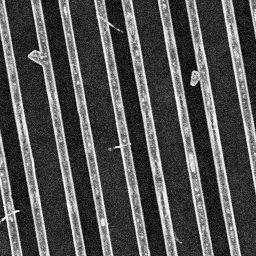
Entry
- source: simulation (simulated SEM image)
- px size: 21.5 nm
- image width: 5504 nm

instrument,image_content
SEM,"parallel lines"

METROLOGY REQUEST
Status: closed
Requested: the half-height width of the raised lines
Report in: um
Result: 0.199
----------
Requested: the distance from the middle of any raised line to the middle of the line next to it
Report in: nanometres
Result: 675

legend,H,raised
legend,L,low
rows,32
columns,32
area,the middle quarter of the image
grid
LLHHLLLLLLLHHLLLLLHHLLLLLLLHHLLL
LLHHLLLLLLLHHLLLLLHHLLLLLLLHHLLL
LLHHLLLLLLLHHLLLLLHHLLLLLLLHHLLL
LLHHLLLLLLLHHHLLLLHHLLLLLLLHHLLL
LLHHLLLLLLLHHHLLLLHHLLLLLLLHHHLL
LLLHHLLLLLLLHHLLLLHHHLLLLLLHHHLL
LLLHHLLLLLLLHHLLLLLHHLLLLLLLHHLL
LLLHHLLLLLLLHHLLLLLHHLLLLLLLHHLL
LLLHHLLLLLLLHHLLLLLHHLLLLLLLHHLL
LLLHHLLLLLLLHHLLLLLHHLLLLLLLHHLL
LLLLHHLLLLLLLHHLLLLHHLLLLLLLHHHL
LLLLHHLLLLLLLHHLLLLHHHLLLLLLLHHL
LLLLHHLLLLLLLHHLLLLLHHLLLLLLLHHL
LLLLHHLLLLLLLHHLLLLLHHLLLLLLLHHL
LLLLHHLLLLLLLHHLLLLLHHLLLLLLLHHL
LLLLHHLLLLLLLHHHLLLLHHHLLLLLLHHL
LLLLLHHLLLLLLLHHLLLLHHHLLLLLLHHH
LLLLLHHLLLLLLLHHLLLLHHHLLLLLLLHH
LLLLLHHLLLLLLLHHLLLLLHHLLLLLLLHH
LLLLLHHLLLLLLLHHLLLLLHHLLLLLLLHH
LLLLLHHLLLLLLLHHHLLLLHHLLLLLLLHH
HLLLLHHLLLLLLLHHHLLLLHHLLLLLLLHH
HLLLLLHHLLLLLLLHHLLLLHHHLLLLLLLH
HLLLLLHHLLLLLLLHHLLLLHHHLLLLLLLH
HLLLLLHHLLLLLLLHHLLLLLHHLLLLLLLH
HLLLLLHHLLLLLLLHHLLLLLHHLLLLLLLH
HHLLLLHHLLLLLLLHHHLLLLHHLLLLLLLH
HHLLLLLHHLLLLLLLHHLLLLHHLLLLLLLH
HHLLLLLHHLLLLLLLHHLLLLHHHLLLLLLL
HHLLLLLHHLLLLLLLHHLLLLLHHLLLLLLL
HHLLLLLHHLLLLLLLHHLLLLLHHLLLLLLL
HHLLLLLHHLLLLLLLHHHLLLLHHLLLLLLL